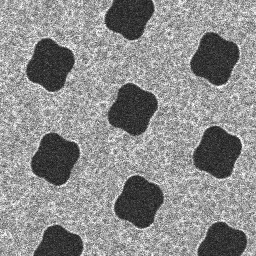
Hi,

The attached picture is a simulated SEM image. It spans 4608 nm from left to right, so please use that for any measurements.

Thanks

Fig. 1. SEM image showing holes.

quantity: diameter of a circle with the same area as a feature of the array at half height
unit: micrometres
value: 0.872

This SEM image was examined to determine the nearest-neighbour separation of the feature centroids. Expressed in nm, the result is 1670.